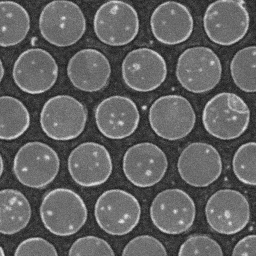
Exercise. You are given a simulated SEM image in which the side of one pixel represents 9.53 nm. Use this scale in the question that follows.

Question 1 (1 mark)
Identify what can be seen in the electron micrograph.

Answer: a regular array of raised bodies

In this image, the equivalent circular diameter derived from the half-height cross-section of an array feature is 424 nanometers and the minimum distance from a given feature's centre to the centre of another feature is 514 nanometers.